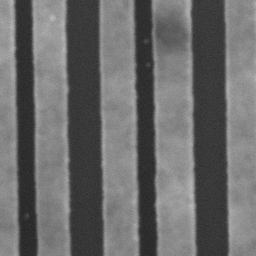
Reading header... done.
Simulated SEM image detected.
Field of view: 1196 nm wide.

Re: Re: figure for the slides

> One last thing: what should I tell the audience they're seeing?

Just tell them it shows lines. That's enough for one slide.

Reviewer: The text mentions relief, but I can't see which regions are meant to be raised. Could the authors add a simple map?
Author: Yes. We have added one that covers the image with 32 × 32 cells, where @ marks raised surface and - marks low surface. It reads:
@@--@@@@-----@@@@--@@@@@----@@@@
@@--@@@@-----@@@@--@@@@@----@@@@
@@--@@@@-----@@@@--@@@@@----@@@@
@@--@@@@-----@@@@--@@@@@----@@@@
@@--@@@@-----@@@@--@@@@@----@@@@
@@--@@@@-----@@@@--@@@@@----@@@@
@@--@@@@-----@@@@--@@@@@----@@@@
@@--@@@@-----@@@@--@@@@@----@@@@
@@--@@@@-----@@@@--@@@@@----@@@@
@@--@@@@-----@@@@--@@@@@----@@@@
@@--@@@@-----@@@@--@@@@@----@@@@
@@--@@@@-----@@@@--@@@@@----@@@@
@@--@@@@-----@@@@--@@@@@----@@@@
@@--@@@@-----@@@@--@@@@@----@@@@
@@--@@@@-----@@@@--@@@@@----@@@@
@@---@@@-----@@@@--@@@@@----@@@@
@@--@@@@-----@@@@--@@@@@----@@@@
@@--@@@@-----@@@@---@@@@----@@@@
@@--@@@@-----@@@@--@@@@@----@@@@
@@--@@@@-----@@@@---@@@@----@@@@
@@--@@@@-----@@@@---@@@@-----@@@
@@--@@@@-----@@@@---@@@@-----@@@
@@---@@@-----@@@@--@@@@@-----@@@
@@---@@@@----@@@@--@@@@@-----@@@
@@---@@@@----@@@@---@@@@-----@@@
@@---@@@@----@@@@---@@@@-----@@@
@@---@@@@----@@@@---@@@@-----@@@
@@---@@@@----@@@@---@@@@-----@@@
@@---@@@@----@@@@---@@@@-----@@@
@@---@@@@----@@@@---@@@@-----@@@
@@---@@@@----@@@@---@@@@-----@@@
@@---@@@@----@@@@---@@@@-----@@@